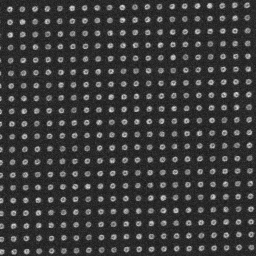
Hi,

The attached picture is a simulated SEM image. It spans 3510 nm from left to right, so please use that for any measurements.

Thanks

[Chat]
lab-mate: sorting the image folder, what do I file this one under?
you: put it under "a regular array of raised bodies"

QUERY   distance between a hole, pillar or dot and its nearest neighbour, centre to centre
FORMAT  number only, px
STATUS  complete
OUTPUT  12.4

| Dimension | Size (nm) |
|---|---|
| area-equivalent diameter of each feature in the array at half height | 72.5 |